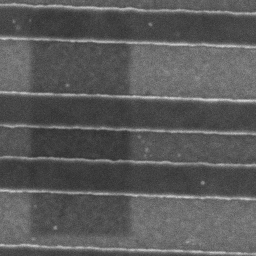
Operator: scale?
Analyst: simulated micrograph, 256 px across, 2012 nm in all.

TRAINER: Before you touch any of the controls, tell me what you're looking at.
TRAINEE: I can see lines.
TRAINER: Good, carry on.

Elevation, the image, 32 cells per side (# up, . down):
................................
#############################...
################################
################################
################################
.....................###########
................................
................................
................................
................................
................................
#...............................
#############################...
################################
################################
################################
.....................###########
................................
................................
................................
##########################......
################################
################################
################################
....................############
................................
................................
................................
................................
................................
................................
#########################.......